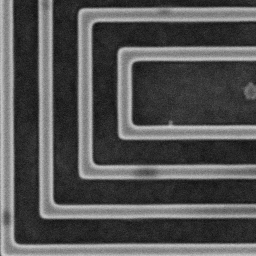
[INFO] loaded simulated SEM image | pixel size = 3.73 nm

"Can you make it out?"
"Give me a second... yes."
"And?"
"groups of lines, slits or small figures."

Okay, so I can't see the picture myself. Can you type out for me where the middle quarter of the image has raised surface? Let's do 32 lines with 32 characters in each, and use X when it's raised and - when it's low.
----XXX-------XXX---------------
----XXX-------XXX---------------
----XXX-------XXX---------------
----XXX-------XXX---------------
----XXX-------XXX---------------
----XXX-------XXX---------------
----XXX-------XXX---------------
----XXX-------XXX---------------
----XXX-------XXX---------------
----XXX-------XXX---------------
----XXX-------XXX---------------
----XXX-------XXX---------------
----XXX-------XXX---------------
----XXX-------XXX---------------
----XXX-------XXX---------------
----XXX-------XXXX--------------
----XXX-------XXXXXXXXXXXXXXXXXX
----XXX-------XXXXXXXXXXXXXXXXXX
----XXX-------XXXXXXXXXXXXXXXXXX
----XXX-------------------------
----XXX-------------------------
----XXX-------------------------
----XXX-------------------------
----XXX-------------------------
----XXX-------------------------
----XXXXX-------------------XXXX
----XXXXXXXXXXXXXXXXXXXXXXXXXXXX
----XXXXXXXXXXXXXXXXXXXXXXXXXXXX
-----XXXXXXXXXXXXXXXXXXXXXXXXXXX
--------------------------------
--------------------------------
--------------------------------